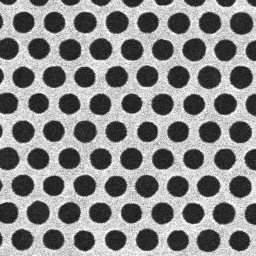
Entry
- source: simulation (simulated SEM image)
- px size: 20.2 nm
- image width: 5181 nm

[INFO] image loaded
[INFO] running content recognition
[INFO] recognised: a regular array of holes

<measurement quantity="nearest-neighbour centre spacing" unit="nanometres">622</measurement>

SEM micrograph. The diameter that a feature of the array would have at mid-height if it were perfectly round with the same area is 454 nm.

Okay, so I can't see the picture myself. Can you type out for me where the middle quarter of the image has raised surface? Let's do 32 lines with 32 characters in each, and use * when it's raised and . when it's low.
*************.******..******.***
***....****.....***....***.....*
***.....**......**......**.....*
.*......**......**......**.....*
***.....**......**.....***.....*
****...*****...****...*****...**
********************************
..******..******..******..******
....***....****....***.....***..
....**......**......**.....***..
....**......**.....***.....***..
....**......***....***.....***..
..******...*****..*****...*****.
********************************
***....*****..******..******..**
***.....***....****....***.....*
**......**......**......**.....*
**......**......**......**.....*
***.....***....****....***.....*
****...*****..******.*******.***
********************************
...*****...****....****...*****.
....***.....**.....***.....***..
....**......**......**......**..
....***.....**......**.....***..
...****....****....****....***..
*********.******..******.*******
********************************
***....****....****....****...**
**......**......**.....***.....*
**......**......**......**.....*
***.....**......**......**.....*